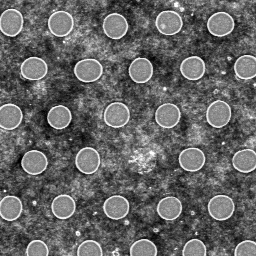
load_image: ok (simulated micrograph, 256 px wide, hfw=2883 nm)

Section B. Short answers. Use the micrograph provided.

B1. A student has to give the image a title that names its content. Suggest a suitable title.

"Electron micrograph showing a regular array of raised bodies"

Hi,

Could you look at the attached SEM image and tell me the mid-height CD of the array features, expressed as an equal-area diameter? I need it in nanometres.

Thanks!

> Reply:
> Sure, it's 275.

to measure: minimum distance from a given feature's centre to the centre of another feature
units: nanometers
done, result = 579